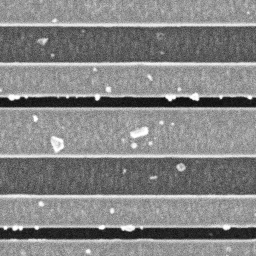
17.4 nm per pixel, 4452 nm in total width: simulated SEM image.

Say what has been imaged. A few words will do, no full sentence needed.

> lines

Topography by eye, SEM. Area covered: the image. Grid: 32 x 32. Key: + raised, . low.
++++++++++++++++++++++++++++++++
++++++++++++++++++++++++++++++++
++++++++++++++++++++++++++++++++
................................
................................
................................
................................
................................
++++++++++++++++++++++++++++++++
++++++++++++++++++++++++++++++++
++++++++++++++++++++++++++++++++
++++++++++++++++++++++++++++++++
................................
................................
++++++++++++++++++++++++++++++++
++++++++++++++++++++++++++++++++
++++++++++++++++++++++++++++++++
++++++++++++++++++++++++++++++++
++++++++++++++++++++++++++++++++
................................
................................
................................
................................
................................
.+++.....+............++.+++++..
++++++++++++++++++++++++++++++++
++++++++++++++++++++++++++++++++
++++++++++++++++++++++++++++++++
.++............++...........+...
................................
++++++++++++++++++++++++++++++++
++++++++++++++++++++++++++++++++